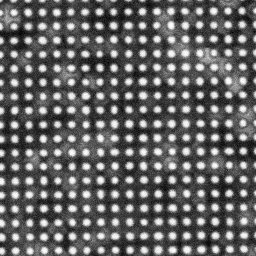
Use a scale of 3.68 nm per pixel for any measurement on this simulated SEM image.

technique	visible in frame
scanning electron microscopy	a regular array of raised bodies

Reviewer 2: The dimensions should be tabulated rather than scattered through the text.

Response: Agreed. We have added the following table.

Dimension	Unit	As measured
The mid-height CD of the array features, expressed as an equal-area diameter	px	6.58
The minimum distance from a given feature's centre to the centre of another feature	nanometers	51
